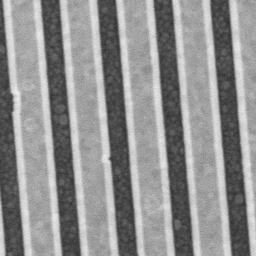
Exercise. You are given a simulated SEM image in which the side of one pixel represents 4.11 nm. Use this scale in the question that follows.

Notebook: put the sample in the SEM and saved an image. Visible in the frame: parallel lines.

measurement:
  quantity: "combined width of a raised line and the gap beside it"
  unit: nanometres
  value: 231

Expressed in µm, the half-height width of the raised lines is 0.128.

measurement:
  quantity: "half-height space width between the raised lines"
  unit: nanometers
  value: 106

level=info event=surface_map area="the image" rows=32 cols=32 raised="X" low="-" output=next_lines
-XXXX---XXXX---XXXX---XXXX---XXX
-XXXX---XXXX---XXXX---XXXX---XXX
-XXXX---XXXX---XXXX---XXXX---XXX
-XXXX---XXXX---XXXX---XXXX---XXX
-XXXX---XXXX---XXXX---XXXX---XXX
-XXXX---XXXX---XXXX---XXXX----XX
-XXXX---XXXX---XXXX---XXXX----XX
-XXXX---XXXX----XXX----XXX----XX
--XXX----XXX----XXX----XXXX---XX
--XXX----XXXX---XXXX---XXXX---XX
--XXXX---XXXX---XXXX---XXXX---XX
--XXXX---XXXX---XXXX---XXXX---XX
--XXXX---XXXX---XXXX---XXXX---XX
--XXXX---XXXX---XXXX---XXXX---XX
--XXXX---XXXX---XXXX---XXXX---XX
--XXXX---XXXX---XXXX---XXXX---XX
--XXXX---XXXX---XXXX---XXXX---XX
--XXXX---XXXX---XXXX---XXXX---XX
--XXXX---XXXX---XXXX----XXX----X
--XXXX---XXXX----XXX----XXX----X
---XXX----XXX----XXX----XXXX---X
---XXX----XXXX---XXXX---XXXX---X
---XXXX---XXXX---XXXX---XXXX---X
---XXXX---XXXX---XXXX---XXXX---X
---XXXX---XXXX---XXXX---XXXX---X
---XXXX---XXXX---XXXX---XXXX---X
---XXXX---XXXX---XXXX---XXXX---X
---XXXX---XXXX---XXXX---XXXX---X
---XXXX---XXXX---XXXX---XXXX----
---XXXX---XXXX---XXXX---XXXX----
---XXXX---XXXX---XXXX----XXX----
---XXXX----XXX----XXX----XXX----